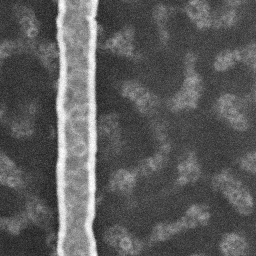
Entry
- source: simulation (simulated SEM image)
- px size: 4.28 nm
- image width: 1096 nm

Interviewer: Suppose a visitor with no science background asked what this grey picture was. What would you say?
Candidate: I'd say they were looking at one or a few lines or trenches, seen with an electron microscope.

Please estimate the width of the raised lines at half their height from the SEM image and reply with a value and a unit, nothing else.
30.2 px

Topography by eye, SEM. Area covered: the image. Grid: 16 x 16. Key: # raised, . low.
....##..........
....##..........
....##..........
....##..........
....##..........
....##..........
....##..........
....##..........
....##..........
....##..........
....##..........
....##..........
....##..........
....##..........
....##..........
....##..........